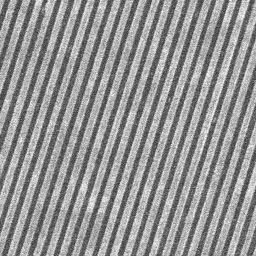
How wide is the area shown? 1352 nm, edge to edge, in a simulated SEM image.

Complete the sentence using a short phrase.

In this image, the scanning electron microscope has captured parallel lines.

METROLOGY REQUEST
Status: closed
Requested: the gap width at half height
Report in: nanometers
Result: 31.5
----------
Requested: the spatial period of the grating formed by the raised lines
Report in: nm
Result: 65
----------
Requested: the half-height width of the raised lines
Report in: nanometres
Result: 31.5